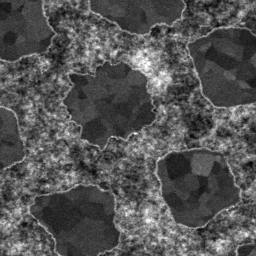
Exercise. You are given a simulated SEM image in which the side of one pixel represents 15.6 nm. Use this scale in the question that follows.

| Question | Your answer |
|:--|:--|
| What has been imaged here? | raised bodies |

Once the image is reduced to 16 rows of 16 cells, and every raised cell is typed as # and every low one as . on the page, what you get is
###...#####.....
###....####.....
###.........####
##..........####
......###...####
....#####....###
....######...###
#....#####......
#....###........
##.........###..
..........####..
..........#####.
..#####...#####.
..#####....###..
...####.........
...####........#